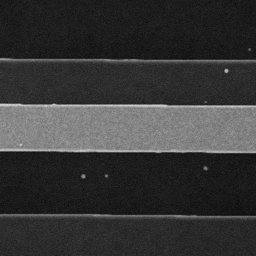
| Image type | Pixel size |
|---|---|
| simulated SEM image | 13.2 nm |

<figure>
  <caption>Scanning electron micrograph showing lines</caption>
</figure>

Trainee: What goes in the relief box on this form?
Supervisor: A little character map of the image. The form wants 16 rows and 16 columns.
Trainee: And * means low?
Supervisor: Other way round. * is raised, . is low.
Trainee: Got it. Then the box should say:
................
................
................
................
****************
****************
****************
****************
****************
.............***
................
................
................
************....
****************
****************